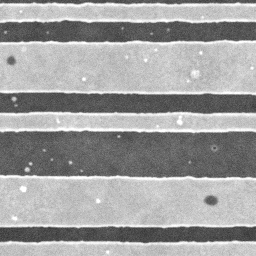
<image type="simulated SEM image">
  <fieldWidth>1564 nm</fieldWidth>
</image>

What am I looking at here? lines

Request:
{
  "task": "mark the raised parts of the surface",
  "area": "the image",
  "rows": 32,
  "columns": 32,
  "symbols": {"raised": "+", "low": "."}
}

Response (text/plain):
......+...++.++..............+..
++++++++++++++++++++++++++++++++
++++++++++++++++++++++++++++++++
................................
................................
++++++++++++++++++++++++++++++++
++++++++++++++++++++++++++++++++
++++++++++++++++++++++++++++++++
++++++++++++++++++++++++++++++++
++++++++++++++++++++++++++++++++
++++++++++++++++++++++++++++++++
++......++++++++++++++++++++++++
................................
................................
++++++++++++++++++++++++++++++++
++++++++++++++++++++++++++++++++
........................+.......
................................
................................
................................
................................
................................
++++++++++++++++++++++++++++++++
++++++++++++++++++++++++++++++++
++++++++++++++++++++++++++++++++
++++++++++++++++++++++++++++++++
++++++++++++++++++++++++++++++++
++++++++++++++++++++++++++++++++
................................
................................
++++++++++++++++++++++++++++++++
++++++++++++++++++++++++++++++++